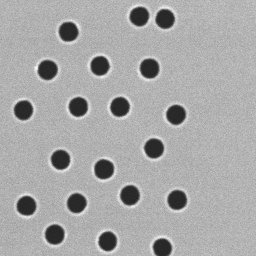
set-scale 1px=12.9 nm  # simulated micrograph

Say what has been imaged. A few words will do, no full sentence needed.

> a regular array of holes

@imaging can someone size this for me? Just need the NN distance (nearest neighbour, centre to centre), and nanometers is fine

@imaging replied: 535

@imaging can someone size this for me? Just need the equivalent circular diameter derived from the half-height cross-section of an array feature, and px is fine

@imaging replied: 20.4